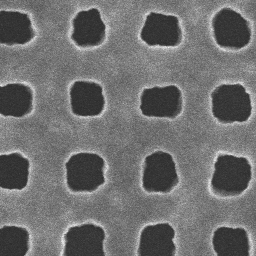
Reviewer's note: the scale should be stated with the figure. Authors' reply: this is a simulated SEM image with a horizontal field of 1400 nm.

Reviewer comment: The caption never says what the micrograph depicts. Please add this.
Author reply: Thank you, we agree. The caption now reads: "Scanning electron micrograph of a regular array of holes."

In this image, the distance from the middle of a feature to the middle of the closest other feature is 384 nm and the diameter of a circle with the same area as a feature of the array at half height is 208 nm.